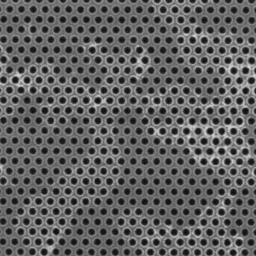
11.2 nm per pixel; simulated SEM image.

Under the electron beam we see a regular array of holes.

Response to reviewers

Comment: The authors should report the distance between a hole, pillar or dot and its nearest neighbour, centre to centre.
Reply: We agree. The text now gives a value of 126 nm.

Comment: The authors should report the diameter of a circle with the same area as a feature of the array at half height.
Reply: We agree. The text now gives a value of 85.5 nm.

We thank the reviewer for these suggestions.